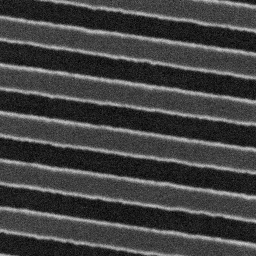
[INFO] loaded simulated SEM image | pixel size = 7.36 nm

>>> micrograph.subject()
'lines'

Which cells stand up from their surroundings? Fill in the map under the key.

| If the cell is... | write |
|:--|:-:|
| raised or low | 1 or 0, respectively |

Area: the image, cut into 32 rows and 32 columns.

00000000111111111111111111111100
00000000000000011111111111111111
11100000000000000000001111111111
11111111111000000000000000000111
11111111111111111000000000000000
00011111111111111111111100000000
00000000001111111111111111111110
00000000000000001111111111111111
11111000000000000000000111111111
11111111111000000000000000000111
11111111111111111000000000000000
00011111111111111111111100000000
00000000011111111111111111111110
00000000000000000111111111111111
11110000000000000000000111111111
11111111110000000000000000000011
11111111111111111100000000000000
00111111111111111111111100000000
00000000001111111111111111111111
00000000000000001111111111111111
11110000000000000000000111111111
11111111111000000000000000000011
11111111111111111100000000000000
00001111111111111111111110000000
00000000001111111111111111111110
00000000000000000111111111111111
11111000000000000000000011111111
11111111111000000000000000000011
11111111111111111100000000000000
00011111111111111111111110000000
00000000000111111111111111111111
00000000000000000111111111111111